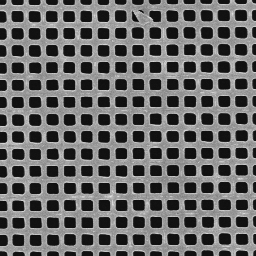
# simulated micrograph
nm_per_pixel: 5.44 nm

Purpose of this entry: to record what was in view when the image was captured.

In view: a regular array of holes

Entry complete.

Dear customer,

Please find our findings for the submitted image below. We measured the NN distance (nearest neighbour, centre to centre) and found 92.1 nm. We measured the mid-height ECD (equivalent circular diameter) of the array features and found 0.0695 microns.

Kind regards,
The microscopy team